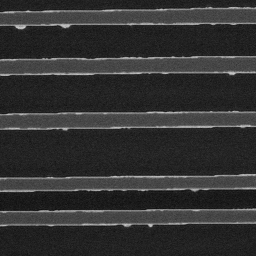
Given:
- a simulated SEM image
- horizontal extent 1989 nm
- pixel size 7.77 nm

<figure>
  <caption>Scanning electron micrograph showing lines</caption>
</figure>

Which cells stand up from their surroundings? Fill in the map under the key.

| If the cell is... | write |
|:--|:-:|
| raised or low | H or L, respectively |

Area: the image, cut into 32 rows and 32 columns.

LLLLLLLLLLLLLLLLLLLLLLLLLLLLLLLL
LLLHLHHHHHHHHHHHHHHHHHHHHHHHHHHH
HHHHHHHHHHHHHHHHHHHHHHHHHHHHHHHH
LLLLLLLLLLLLLLLLLLLLLLLLLLLLLLLL
LLLLLLLLLLLLLLLLLLLLLLLLLLLLLLLL
LLLLLLLLLLLLLLLLLLLLLLLLLLLLLLLL
LLLLLLLLLLLLLLLLLLLLLLLLLLLLLLLL
HHHHHHHHHHHHHHHHHHHHHHHHHHHHHHHH
HHHHHHHHHHHHHHHHHHHHHHHHHHHHHHHH
LLLLLLLLLLLLLLLLLLLLLLLLLLLLLLLL
LLLLLLLLLLLLLLLLLLLLLLLLLLLLLLLL
LLLLLLLLLLLLLLLLLLLLLLLLLLLLLLLL
LLLLLLLLLLLLLLLLLLLLLLLLLLLLLLLL
LLLLLLLLLLLLLLLLLLLLLLLLLLLLLLLL
HHHHHHHHHHHHHHHHHHHHHHHHHHHHHHHH
HHHHHHHHHHHHHHHHHHHHHHHHHHHHHHHH
LLLLLLLLLLLLLLLLLLLLLLLLLLLLLLLL
LLLLLLLLLLLLLLLLLLLLLLLLLLLLLLLL
LLLLLLLLLLLLLLLLLLLLLLLLLLLLLLLL
LLLLLLLLLLLLLLLLLLLLLLLLLLLLLLLL
LLLLLLLLLLLLLLLLLLLLLLLLLLLLLLLL
LLLLLLLLLLLLLLLLLLLLLLLLLLLLLLLL
HHHHHHHHHHHHHHHHHHHHHHHHHHHHHHHH
HHHHHHHHHHHHHHHHHHHHHHHHHHHHHHHH
LLLLLLLLLLLLLLLLLLLLLLLLLLLLLLLL
LLLLLLLLLLLLLLLLLLLLLLLLLLLLLLLL
HHHHHHHHHHHHHHHHHHHHHHHHHHHHHHHH
HHHHHHHHHHHHHHHHHHHHHHHHHHHHHHHH
LLLLLLLLLLLLLLLLLLLLLLLLLLLLLLLL
LLLLLLLLLLLLLLLLLLLLLLLLLLLLLLLL
LLLLLLLLLLLLLLLLLLLLLLLLLLLLLLLL
LLLLLLLLLLLLLLLLLLLLLLLLLLLLLLLL